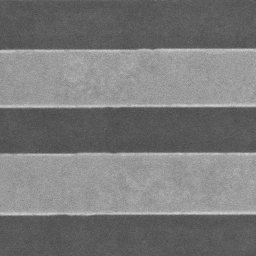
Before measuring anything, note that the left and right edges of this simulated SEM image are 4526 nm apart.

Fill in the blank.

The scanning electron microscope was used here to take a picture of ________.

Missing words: lines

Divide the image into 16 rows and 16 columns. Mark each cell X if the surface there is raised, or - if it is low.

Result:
----------------
----------------
----------------
XXXXXXXXXXXXXXXX
XXXXXXXXXXXXXXXX
XXXXXXXXXXXXXXXX
XXXXXXXXXXXXXXXX
----------------
----------------
----------------
XXXXXXXXXXXXXXXX
XXXXXXXXXXXXXXXX
XXXXXXXXXXXXXXXX
----------------
----------------
----------------